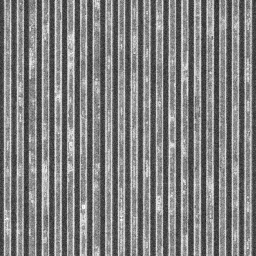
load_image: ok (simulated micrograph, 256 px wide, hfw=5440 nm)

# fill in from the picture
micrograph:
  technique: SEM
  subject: parallel lines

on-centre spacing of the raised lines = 269 nm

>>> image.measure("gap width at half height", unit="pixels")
6.88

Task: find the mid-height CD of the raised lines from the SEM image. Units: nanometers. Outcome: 125